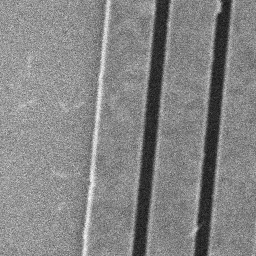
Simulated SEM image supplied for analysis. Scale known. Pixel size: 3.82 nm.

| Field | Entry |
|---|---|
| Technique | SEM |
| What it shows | one or a few lines or trenches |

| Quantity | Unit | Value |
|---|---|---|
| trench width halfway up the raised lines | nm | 56.1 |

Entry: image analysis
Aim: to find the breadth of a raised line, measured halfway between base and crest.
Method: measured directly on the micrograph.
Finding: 0.182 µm